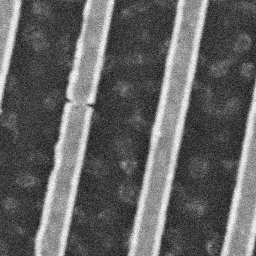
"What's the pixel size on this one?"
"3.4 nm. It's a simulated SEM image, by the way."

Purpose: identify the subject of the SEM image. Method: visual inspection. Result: one or a few lines or trenches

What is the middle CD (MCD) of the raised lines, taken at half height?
22.3 pixels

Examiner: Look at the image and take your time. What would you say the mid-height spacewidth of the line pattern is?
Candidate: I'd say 234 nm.